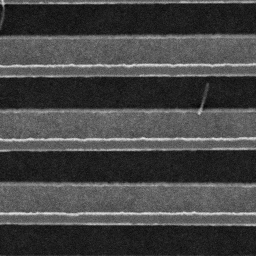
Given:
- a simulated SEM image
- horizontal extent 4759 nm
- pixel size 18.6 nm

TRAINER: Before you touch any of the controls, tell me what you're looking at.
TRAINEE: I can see lines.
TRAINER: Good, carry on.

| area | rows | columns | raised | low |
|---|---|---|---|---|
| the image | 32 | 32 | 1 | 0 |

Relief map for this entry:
10000000000000000000000000000000
00000000000000000000000000000000
00000000000000000000000000000000
00000000000000000000000000000000
00000000000000000000000000000000
11111111111111111111111111111111
11111111111111111111111111111111
11111111111111111111111111111111
11111111111111111111111111111111
11101011000000000000000000000000
00000000000000000000000000000000
00000000000000000000000000000000
00000000000000000000000000000000
00000000000000000000000000000000
11111111111111111111111111111111
11111111111111111111111111111111
11111111111111111111111111111111
11111111111111111111111111111111
11111111111111111111111111111111
00000000000000000000000000000000
00000000000000000000000000000000
00000000000000000000000000000000
00000000000000000000000000000000
11111111111111111111111111111111
11111111111111111111111111111111
11111111111111111111111111111111
11111111111111111111111111111111
11111111111111111111111111111111
00000000000000000000000000000000
00000000000000000000000000000000
00000000000000000000000000000000
00000000000000000000000000000000